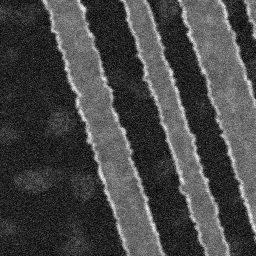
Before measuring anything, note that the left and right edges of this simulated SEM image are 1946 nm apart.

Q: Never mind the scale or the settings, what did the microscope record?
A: one or a few lines or trenches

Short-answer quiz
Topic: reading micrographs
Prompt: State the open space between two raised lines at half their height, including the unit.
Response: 254 nanometers